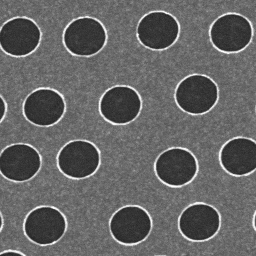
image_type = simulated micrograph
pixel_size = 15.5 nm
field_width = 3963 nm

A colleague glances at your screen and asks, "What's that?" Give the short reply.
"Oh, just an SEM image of a regular array of holes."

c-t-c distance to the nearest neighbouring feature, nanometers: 1060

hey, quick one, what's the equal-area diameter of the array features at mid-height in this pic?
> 608 nm